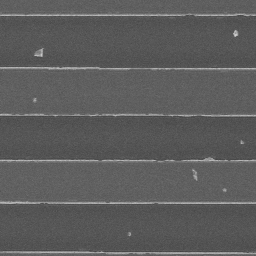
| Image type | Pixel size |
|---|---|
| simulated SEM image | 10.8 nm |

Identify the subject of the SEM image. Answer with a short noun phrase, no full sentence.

lines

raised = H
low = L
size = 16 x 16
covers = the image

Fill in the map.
HHHHHHHHHHHHHHHH
LLLLLLLLLLLLLLLL
LLLLLLLLLLLLLLLL
LLLLLLLLLLLLLLLL
HHHHHHHHHHHHHHHH
HHHHHHHHHHHHHHHH
HHHHHHHHHHHHHHHH
LLLLLLLLLLLLLLLL
LLLLLLLLLLLLLLLL
LLLLLLLLLLLLLLLL
HHHHHHHHHHHHHHHH
HHHHHHHHHHHHHHHH
HHHHHHHHHHHHHHHH
LLLLLLLLLLLLLLLL
LLLLLLLLLLLLLLLL
LLLLLLLLLLLLLLLL